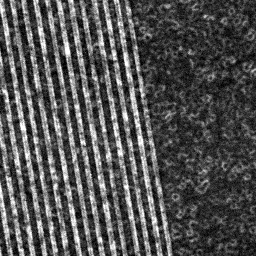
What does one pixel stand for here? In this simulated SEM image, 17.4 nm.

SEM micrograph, parallel lines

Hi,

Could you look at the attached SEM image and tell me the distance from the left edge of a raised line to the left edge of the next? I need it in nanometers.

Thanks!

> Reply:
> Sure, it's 197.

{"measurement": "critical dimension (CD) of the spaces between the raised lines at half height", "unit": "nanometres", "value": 129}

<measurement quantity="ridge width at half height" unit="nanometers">64.5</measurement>